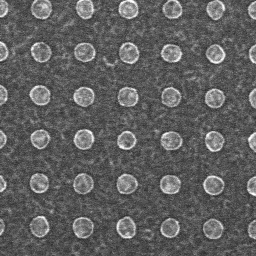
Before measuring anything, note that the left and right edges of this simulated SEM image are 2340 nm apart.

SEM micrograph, a regular array of raised bodies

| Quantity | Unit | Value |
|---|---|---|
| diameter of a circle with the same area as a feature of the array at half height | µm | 0.176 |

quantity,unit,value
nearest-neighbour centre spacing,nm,394